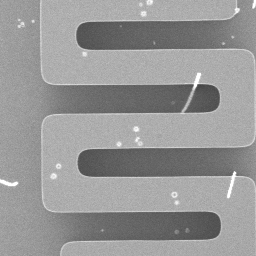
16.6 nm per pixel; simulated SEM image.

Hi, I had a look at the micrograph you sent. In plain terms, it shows groups of lines, slits or small figures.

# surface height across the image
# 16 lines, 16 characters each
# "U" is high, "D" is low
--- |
DDDUUUUUUUUUUUUD
DDDUUDDDDDDDDDDD
DDDUUDDDDDDDDDDD
DDDUUUUUUUUUUUUU
DDDUUUUUUUUUUUUU
DDDDDDDDDDDDDUUU
DDDDDDDDDDDDDDUU
DDDUUUUUUUUUUUUU
DDDUUUUUUUUUUUUU
DDDUUDDDDDDDDDDD
DDDUUDDDDDDDDDDD
DDDUUUUUUUUUUUUU
DDDUUUUUUUUUUUUU
DDDDDDDDDDDDDDUU
DDDDDDDDDDDDDDUU
DDDDUUUUUUUUUUUU